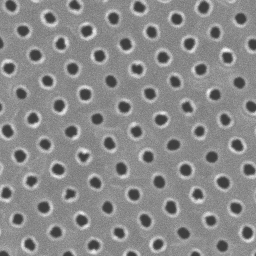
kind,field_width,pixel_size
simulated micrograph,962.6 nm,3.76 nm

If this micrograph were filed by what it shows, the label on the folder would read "a regular array of holes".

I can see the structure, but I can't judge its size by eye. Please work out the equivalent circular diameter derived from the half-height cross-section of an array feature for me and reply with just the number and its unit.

41.2 nanometres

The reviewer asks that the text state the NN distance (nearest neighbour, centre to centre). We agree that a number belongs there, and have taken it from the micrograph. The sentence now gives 104 nm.